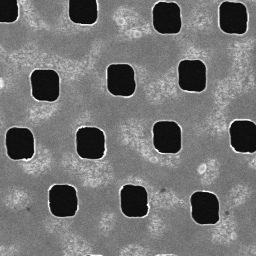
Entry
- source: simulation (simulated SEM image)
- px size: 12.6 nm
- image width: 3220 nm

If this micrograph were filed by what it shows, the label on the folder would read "a regular array of holes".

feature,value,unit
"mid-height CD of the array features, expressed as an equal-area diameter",402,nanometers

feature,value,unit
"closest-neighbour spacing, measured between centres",64.3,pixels